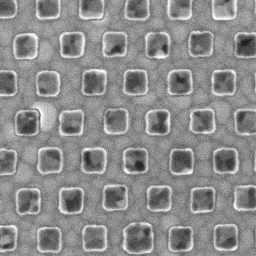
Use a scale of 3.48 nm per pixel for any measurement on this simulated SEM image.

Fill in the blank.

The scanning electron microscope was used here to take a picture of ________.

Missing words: a regular array of raised bodies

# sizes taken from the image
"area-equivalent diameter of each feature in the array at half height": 94.1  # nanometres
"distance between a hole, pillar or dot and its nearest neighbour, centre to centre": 148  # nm